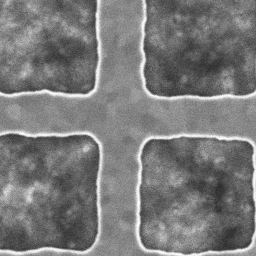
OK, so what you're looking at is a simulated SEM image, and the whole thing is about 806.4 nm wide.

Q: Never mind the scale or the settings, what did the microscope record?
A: holes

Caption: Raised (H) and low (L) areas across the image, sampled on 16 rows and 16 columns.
LLLLLLHHHLLLLLLL
LLLLLLHHHLLLLLLL
LLLLLLHHHLLLLLLL
LLLLLLHHHLLLLLLL
LLLLLLHHHLLLLLLL
LLLLLLHHHLLLLLLL
HHHHHHHHHHHHHHHH
HHHHHHHHHHHHHHHH
LLLLLLHHHHHHHHHH
LLLLLLHHHLLLLLLL
LLLLLLHHHLLLLLLL
LLLLLLHHHLLLLLLL
LLLLLLHHHLLLLLLL
LLLLLLHHHLLLLLLL
LLLLLLHHHLLLLLLL
LLLLLLHHHLLLLLLH